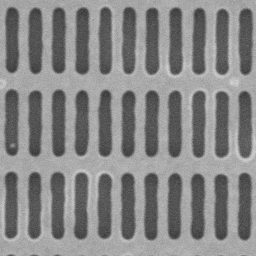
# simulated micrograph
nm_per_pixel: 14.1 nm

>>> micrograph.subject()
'groups of lines, slits or small figures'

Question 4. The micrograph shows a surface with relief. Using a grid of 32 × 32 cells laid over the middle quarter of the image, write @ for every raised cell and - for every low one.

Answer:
-@@---@@@---@@----@@----@@----@@
@@@---@@@---@@@---@@----@@----@@
@@@@-@@@@--@@@@--@@@@--@@@@--@@@
@@@@@@@@@@@@@@@@@@@@@@@@@@@@@@@@
@@@@@@@@@@@@@@@@@@@@@@@@@@@@@@@@
@@@@@@@@@@@@@@@@@@@@@@@@@@@@@@@@
@@@@-@@@@@-@@@@@-@@@@--@@@@-@@@@
@@@---@@@---@@@---@@----@@---@@@
-@@---@@@---@@----@@----@@----@@
-@@---@@@---@@----@@----@@----@@
-@@---@@@---@@----@@----@@----@@
-@@---@@----@@----@@----@@----@@
-@@---@@----@@----@@----@@----@@
-@@---@@----@@----@@----@@----@@
-@@---@@@---@@----@@----@@----@@
-@----@@@---@@----@@----@@----@@
-@----@@@---@@----@@----@@----@@
-@@---@@----@@----@@----@@----@@
-@@---@@@---@@----@@----@@----@@
-@----@@@---@@----@@----@@----@@
-@----@@@---@@----@@----@@----@@
-@@---@@----@@----@@----@@---@@@
@@@---@@@---@@@--@@@---@@@---@@@
@@@@@@@@@@@@@@@@@@@@@@@@@@@-@@@@
@@@@@@@@@@@@@@@@@@@@@@@@@@@@@@@@
@@@@@@@@@@@@@@@@@@@@@@@@@@@@@@@@
@@@@@@@@@@@@@@@@@@@@@@@@@@@@@@@@
@@@---@@@--@@@@--@@@@--@@@@--@@@
-@----@@----@@----@@----@@---@@@
-@----@@----@@----@@----@@----@@
-@----@@----@@----@@----@@----@@
-@----@@----@@----@@---@@@----@@